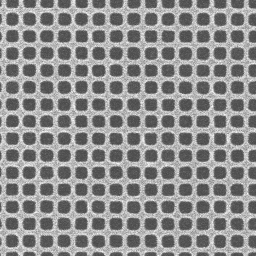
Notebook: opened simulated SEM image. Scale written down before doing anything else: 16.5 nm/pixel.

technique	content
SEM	a regular array of holes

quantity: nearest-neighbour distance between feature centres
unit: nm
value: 276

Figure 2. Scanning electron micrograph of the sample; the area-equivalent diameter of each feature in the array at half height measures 236 nm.